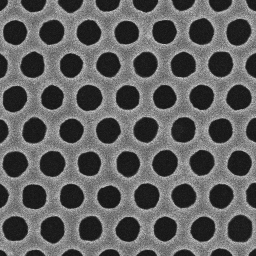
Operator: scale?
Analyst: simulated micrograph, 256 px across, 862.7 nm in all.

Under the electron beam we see a regular array of holes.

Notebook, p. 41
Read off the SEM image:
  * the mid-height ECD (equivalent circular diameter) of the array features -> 82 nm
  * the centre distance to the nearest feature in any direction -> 0.124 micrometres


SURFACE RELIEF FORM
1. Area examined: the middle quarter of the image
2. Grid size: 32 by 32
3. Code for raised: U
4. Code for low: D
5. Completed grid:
DDDDDUUUDDDDDDUUUDDDDDDUUUUDDDDD
DDDDUUUUDDDDDDUUUUDDDDDUUUUDDDDD
DDDDUUUUUDDDDUUUUUDDDDUUUUUDDDDD
UDUUUUUUUUUUUUUUUUUUUUUUUUUUUUUU
UUUUUUUUUUUUUUUUUUUUUUUUUUUUUUUU
UUUUUDDUUUUUUUUDDUUUUUUUDDUUUUUU
UUUUDDDDDUUUUUDDDDUUUUUDDDDUUUUU
UUUDDDDDDUUUUDDDDDDUUUDDDDDDUUUU
UUUDDDDDDDUUUDDDDDDUUUDDDDDDUUUD
UUUDDDDDDUUUUDDDDDDUUUDDDDDDUUUU
UUUUDDDDDUUUUUDDDDUUUUUDDDDUUUUU
UUUUUDDUUUUUUUUUUUUUUUUUUUUUUUUU
UUUUUUUUUUUUUUUUUUUUUUUUUUUUUUUU
UUUUUUUUUUUUUUUUUUUUDUUUUUUUUDDU
DDDDUUUUUDDDDUUUUUDDDDDUUUUUDDDD
DDDDDUUUDDDDDDUUUUDDDDDUUUUDDDDD
DDDDDUUUDDDDDDUUUDDDDDDUUUUDDDDD
DDDDDUUUDDDDDDUUUDDDDDDUUUUDDDDD
DDDDUUUUDDDDDUUUUUDDDDUUUUUDDDDD
UDDUUUUUUDDDUUUUUUUUDUUUUUUUUDUU
UUUUUUUUUUUUUUUUUUUUUUUUUUUUUUUU
UUUUUUUUUUUUUUUUUUUUUUUUUDUUUUUU
UUUUDDDDUUUUUUDDDDUUUUUDDDDDUUUU
UUUUDDDDDUUUUDDDDDUUUUUDDDDDUUUU
UUUDDDDDDUUUUDDDDDDUUUDDDDDDDUUD
UUUUDDDDDUUUUDDDDDDUUUDDDDDDUUUU
UUUUDDDDDUUUUDDDDDUUUUUDDDDDUUUU
UUUUUDDDUUUUUUUDDDUUUUUDDDDUUUUU
UUUUUUUUUUUUUUUUUUUUUUUUUUUUUUUU
UUUUUUUUUUUUUUUUUUUUUUUUUUUUUUUU
DDDUUUUUUUUDUUUUUUUDDDDUUUUUDDDD
DDDDUUUUUDDDDDUUUUDDDDDDUUUDDDDD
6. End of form